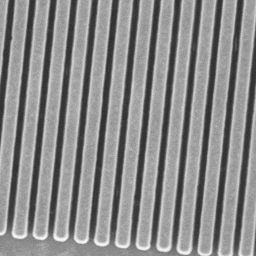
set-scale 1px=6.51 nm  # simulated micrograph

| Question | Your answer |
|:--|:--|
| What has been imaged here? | parallel lines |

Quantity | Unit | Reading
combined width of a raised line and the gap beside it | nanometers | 135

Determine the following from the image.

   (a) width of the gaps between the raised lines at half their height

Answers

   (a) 0.0389 microns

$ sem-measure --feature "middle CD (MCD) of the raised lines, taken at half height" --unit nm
96.3